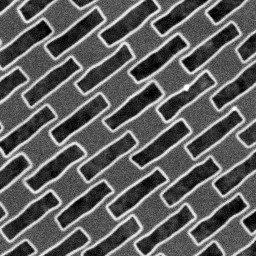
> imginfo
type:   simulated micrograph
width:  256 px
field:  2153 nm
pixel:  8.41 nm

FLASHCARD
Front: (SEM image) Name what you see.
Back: groups of lines, slits or small figures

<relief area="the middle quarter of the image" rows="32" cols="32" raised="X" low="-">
----XXXX-------XXX-------XXXXX--
----XX--------XXX-------XXXXXXX-
--XXX-------XXXXX-----XXXXXXXXXX
-XXXX------XXXXXX----XXXXXXXXXXX
XXX------XXXXXXXXX-XXX-XXXXXXXXX
XXX-----XXXXXXXXXXXXX---XXXXXXX-
XXXX---XXXXXXXXXXXX-----XXXXXX--
XXXXXXXXXXXXXXXXXX-------XXX----
XXXXXXX---XXXXXXX-------XX------
XXXXXX-----XXXX--------XX-------
XXXXX------XXXX------XXX------XX
XXX-------XXX-------XXX------XXX
XX-------XXX-------XXXXX----XXXX
X-------XXX------XXXXXXXX--XXXXX
------XXXX------XXXXXXXXXXXX--XX
-----XXXXXX---XXXXXXXXXXXXX----X
----XXXXXXXX-XXXXXXXXXXXXX------
--XXXXXXXXXXXXX--XXXXXXX-------X
-XXXXXXXXXXXXX---XXXXXX-------XX
XXXXXXXXXXXXX-----XXXX-------XXX
X---XXXXXXX-------XXX------XXX--
-----XXXXX-------XX-------XXXXX-
-----XXX-------XXX-------XXXXXXX
-----XX------XXXX-------XXXXXXXX
---XXX------XXXXX-----XXXXXXXXXX
-XXX-------XXXXXXXX-XXXXXXXXXXXX
XXXX------XXXXXXXXXXXXX-XXXXXXXX
XXXX-----XXXXXXXXXXXXX---XXXXX--
XXXXX--XXXXXXXXXXXXX------XXX---
XXXXXXXXX-XXXXXXXXX------XXX----
XXXXXXXX---XXXXXX-------XXX-----
XXXXXX------XXX-------XXXX------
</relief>